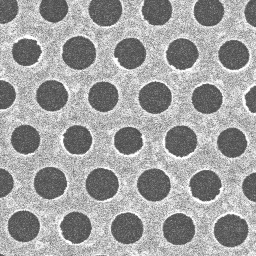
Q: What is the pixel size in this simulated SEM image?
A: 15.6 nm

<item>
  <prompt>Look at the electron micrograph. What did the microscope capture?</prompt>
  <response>a regular array of holes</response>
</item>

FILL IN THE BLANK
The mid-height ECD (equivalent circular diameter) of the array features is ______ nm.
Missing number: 498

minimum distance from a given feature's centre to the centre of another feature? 786 nm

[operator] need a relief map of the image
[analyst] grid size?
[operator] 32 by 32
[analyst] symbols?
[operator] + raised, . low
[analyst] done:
..+++...+++....+++...+++....+++.
..+++....++....+++....++....+++.
..++++..+++....+++...++++...+++.
++++++++++++++++++++++++++++++++
++++++++++++++++++++++++++++++++
++...+++....+++...+++...++++..++
+....+++....++....+++....++....+
++...+++....+++...+++....++....+
+++++++++..+++++.+++++..++++..++
++++++++++++++++++++++++++++++++
.++++...++++..++++...+++++++++++
..+++...+++....++....+++....+++.
..+++...+++....++....+++....+++.
.++++...++++..++++...+++...++++.
++++++++++++++++++++++++++++++++
++++++++++++++++++++++++++++++++
++...+++...++++...+++...++++..++
+....+++....++....+++....++....+
++...+++...+++....+++....++....+
++++++++++++++++++++++.+++++..++
++++++++++++++++++++++++++++++++
.++++...+++...++++..+++++..+++++
..++....+++....++....+++....++..
..++....+++....++....+++....++..
.++++...+++...++++...+++...++++.
++++++++++++++++++++++++++++++++
++..+++++.++++++++++++++++++++++
+....+++...+++....+++...+++...++
+....++....+++....++....+++....+
+....+++...+++....+++...+++....+
+++++++++++++++++++++..+++++..++
++++++++++++++++++++++++++++++++